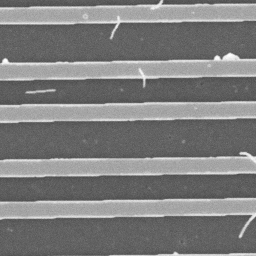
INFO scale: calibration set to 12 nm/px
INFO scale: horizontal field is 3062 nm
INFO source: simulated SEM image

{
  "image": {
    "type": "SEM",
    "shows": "lines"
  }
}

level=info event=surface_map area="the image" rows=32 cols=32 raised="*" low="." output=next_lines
....................*...........
********************************
******************************..
................................
................................
................................
................................
.............................***
********************************
*******************************.
................................
................................
................................
********************************
********************************
................................
................................
................................
................................
...............................*
********************************
********************************
................................
................................
................................
********************************
********************************
................................
................................
................................
................................
................................